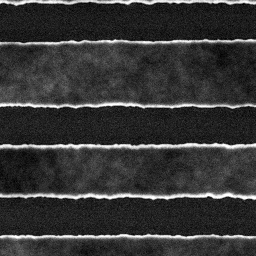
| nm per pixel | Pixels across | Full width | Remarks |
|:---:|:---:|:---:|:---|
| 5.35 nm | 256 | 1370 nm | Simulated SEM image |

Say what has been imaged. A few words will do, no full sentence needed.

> lines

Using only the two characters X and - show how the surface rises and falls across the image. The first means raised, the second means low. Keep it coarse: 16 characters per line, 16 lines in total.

----------------
----------------
------------X-XX
XXXXXXXXXXXXXXXX
XXXXXXXXXXXXXXXX
XXXXXXXXXXXXXXXX
XXXXXXXXXXXXXXXX
----------------
----------------
XXXXXXXXXXXXXXXX
XXXXXXXXXXXXXXXX
XXXXXXXXXXXXXXXX
----------------
----------------
----------------
XXXXXXXXXXXXXXXX